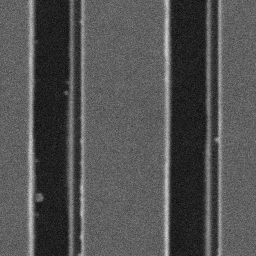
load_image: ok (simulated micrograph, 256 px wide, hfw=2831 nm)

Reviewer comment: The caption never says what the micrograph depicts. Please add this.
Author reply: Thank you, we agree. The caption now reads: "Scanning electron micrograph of lines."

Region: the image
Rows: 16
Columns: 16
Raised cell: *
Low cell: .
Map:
**...*****....**
**...*****....**
**...*****....**
**...*****....**
**...*****....**
**...*****....**
**...*****....**
**...*****....**
**...*****....**
**...*****....**
**...*****....**
**...*****....**
**...*****....**
**...*****....**
**...*****....**
**...*****....**